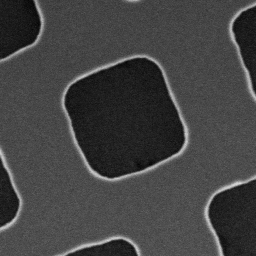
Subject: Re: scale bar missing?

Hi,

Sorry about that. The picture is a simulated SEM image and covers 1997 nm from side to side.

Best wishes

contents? holes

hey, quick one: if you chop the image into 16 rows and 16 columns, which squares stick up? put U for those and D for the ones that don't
DDUUUUUUUUUUUUUU
DDDUUUUUUUUUUUUD
DDUUUUUUUUUUUUUD
DUUUUUUUUUUUUUUD
UUUUUUDDDDUUUUUD
UUUUDDDDDDUUUUUU
UUUUDDDDDDDUUUUU
UUUUDDDDDDDUUUUU
UUUUUDDDDDDDUUUU
UUUUUDDDDDDUUUUU
UUUUUUDDDUUUUUUU
DUUUUUUUUUUUUUUD
DUUUUUUUUUUUUDDD
DUUUUUUUUUUUUDDD
UUUUUUUUUUUUUDDD
UUUUUDDDUUUUUUDD